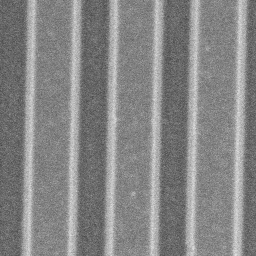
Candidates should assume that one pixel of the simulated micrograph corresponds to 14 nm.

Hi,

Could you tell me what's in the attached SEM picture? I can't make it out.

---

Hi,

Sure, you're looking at one or a few lines or trenches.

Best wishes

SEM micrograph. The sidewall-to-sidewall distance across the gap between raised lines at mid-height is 502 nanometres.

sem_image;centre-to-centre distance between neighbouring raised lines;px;82.1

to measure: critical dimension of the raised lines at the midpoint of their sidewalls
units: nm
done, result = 647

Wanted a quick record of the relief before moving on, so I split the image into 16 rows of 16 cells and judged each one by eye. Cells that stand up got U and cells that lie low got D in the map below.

DDUUUDDUUUDDUUUD
DDUUUDDUUUDDUUUD
DDUUUDDUUUDDUUUD
DDUUUDDUUUDDUUUD
DDUUUDDUUUDDUUUD
DDUUUDDUUUDDUUUD
DDUUUDDUUUDDUUUD
DDUUUDDUUUDDUUUD
DDUUUDDUUUDDUUUD
DDUUUDDUUUDDUUUD
DDUUUDDUUUDDUUUD
DDUUUDDUUUDDUUUD
DDUUUDDUUUDDUUUD
DDUUUDDUUUDDUUUD
DDUUUDDUUUDDUUUD
DDUUUDDUUUDDUUUD